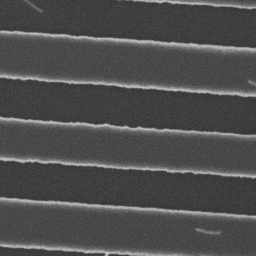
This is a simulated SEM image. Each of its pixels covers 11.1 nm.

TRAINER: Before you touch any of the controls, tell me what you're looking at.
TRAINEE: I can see lines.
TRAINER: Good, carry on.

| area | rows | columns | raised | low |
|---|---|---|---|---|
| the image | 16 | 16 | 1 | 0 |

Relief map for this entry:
0000000000000000
0000000000000000
1111111110000000
1111111111111111
1111111111111111
0000000001111111
0000000000000000
1100000000000000
1111111111111111
1111111111111111
0000000111111111
0000000000000000
1100000000000000
1111111111111111
1111111111111111
0111111111111111